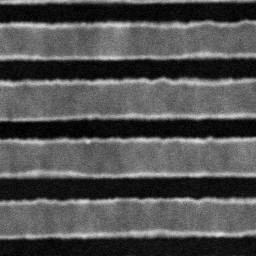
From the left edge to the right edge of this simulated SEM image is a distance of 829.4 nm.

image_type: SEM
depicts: lines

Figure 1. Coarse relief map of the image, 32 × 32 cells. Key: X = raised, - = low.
--------------------------------
--------------------------------
--------------------------------
XXXXXXXXXXXXXXXXXXXXXXXXXXXXXXXX
XXXXXXXXXXXXXXXXXXXXXXXXXXXXXXXX
XXXXXXXXXXXXXXXXXXXXXXXXXXXXXXXX
XXXXXXXXXXXXXXXXXXXXXXXXXXXXXXXX
--------------------------------
--------------------------------
--------------------------------
XXXXXXXXXXXXXXXXXXXXXXXXXXXXXXXX
XXXXXXXXXXXXXXXXXXXXXXXXXXXXXXXX
XXXXXXXXXXXXXXXXXXXXXXXXXXXXXXXX
XXXXXXXXXXXXXXXXXXXXXXXXXXXXXXXX
XXXXXXXXXXXXXXXXXXXXXXXXXXXXXXXX
--------------------------------
--------------------------------
XXXXX-XXXXXXXXXXXXXXXXXXXXXXXXXX
XXXXXXXXXXXXXXXXXXXXXXXXXXXXXXXX
XXXXXXXXXXXXXXXXXXXXXXXXXXXXXXXX
XXXXXXXXXXXXXXXXXXXXXXXXXXXXXXXX
XXXXXXXXXXXXXXXXXXXXXXXXXXXXXXXX
--------------------------------
--------------------------------
--------------------------------
XXXXXXXXXXXXXXXXXXXXXXXXXXXXXXXX
XXXXXXXXXXXXXXXXXXXXXXXXXXXXXXXX
XXXXXXXXXXXXXXXXXXXXXXXXXXXXXXXX
XXXXXXXXXXXXXXXXXXXXXXXXXXXXXXXX
XXXXXXXXXXXXXXXXXXXXXXXXXXXXXXX-
--------------------------------
--------------------------------